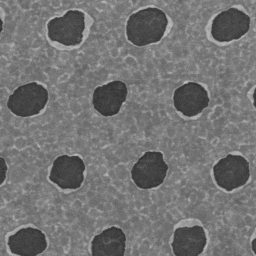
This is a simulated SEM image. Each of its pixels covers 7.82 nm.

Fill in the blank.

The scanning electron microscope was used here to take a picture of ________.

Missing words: a regular array of holes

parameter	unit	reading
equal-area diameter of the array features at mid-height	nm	289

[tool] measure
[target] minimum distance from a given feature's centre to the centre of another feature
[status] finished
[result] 81.5 pixels